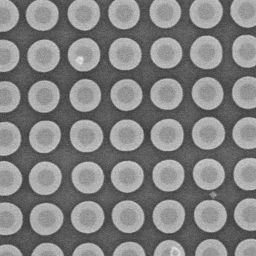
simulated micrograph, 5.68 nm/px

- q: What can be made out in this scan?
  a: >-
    an array of small figures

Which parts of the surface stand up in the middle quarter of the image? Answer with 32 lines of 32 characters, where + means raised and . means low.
..++++++....++++++......++++....
...+++..........................
................................
................................
...++++......+++++.....+++++....
..++++++....+++++++...+++++++...
..+++++++...+++++++...+++++++...
..+++++++...+++++++...+++++++...
..+++++++...+++++++...+++++++...
..+++++++...+++++++...+++++++...
..++++++.....+++++.....+++++....
....+++........+................
................................
................................
...++++.......++++......++++....
..+++++++....++++++...+++++++...
..+++++++...++++++++..++++++++..
..++++++++..++++++++..++++++++..
..++++++++..++++++++..++++++++..
..+++++++...+++++++...+++++++...
...++++++...+++++++....++++++...
....+++.......+++.......+++.....
................................
................................
...............++.......++++....
...++++++....++++++....++++++...
..+++++++...++++++++..++++++++..
..++++++++..++++++++..++++++++..
..++++++++..++++++++..++++++++..
..++++++++..+++++++....+++++++..
...++++++....++++++....++++++...
....++++......++++.......+++....